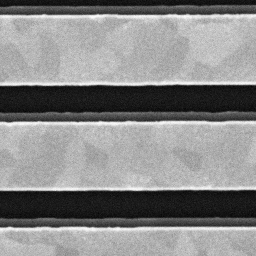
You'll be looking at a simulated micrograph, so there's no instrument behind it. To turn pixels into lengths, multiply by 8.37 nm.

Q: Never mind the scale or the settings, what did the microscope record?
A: lines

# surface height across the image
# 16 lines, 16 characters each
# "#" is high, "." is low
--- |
................
################
################
################
################
................
................
................
################
################
################
################
................
................
################
################